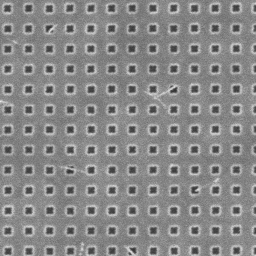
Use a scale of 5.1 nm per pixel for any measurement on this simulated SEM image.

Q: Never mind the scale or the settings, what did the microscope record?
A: a regular array of holes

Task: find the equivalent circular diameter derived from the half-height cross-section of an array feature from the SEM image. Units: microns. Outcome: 0.0415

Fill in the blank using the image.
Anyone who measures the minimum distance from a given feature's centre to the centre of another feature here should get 0.102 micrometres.